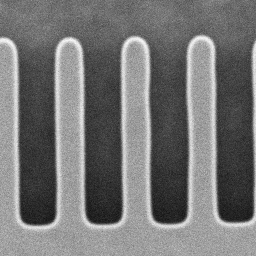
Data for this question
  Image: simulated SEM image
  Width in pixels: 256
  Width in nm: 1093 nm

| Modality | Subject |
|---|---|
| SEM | groups of lines, slits or small figures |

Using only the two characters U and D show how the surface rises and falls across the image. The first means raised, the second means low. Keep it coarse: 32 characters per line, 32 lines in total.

DDDDDDDDDDDDDDDDDDDDDDDDDDDDDDDD
DDDDDDDDDDDDDDDDDDDDDDDDDDDDDDDD
DDDDDDDDDDDDDDDDDDDDDDDDDDDDDDDD
DDDDDDDDDDDDDDDDDDDDDDDDDDDDDDDD
DDDDDDDDDDDDDDDDDDDDDDDDDDDDDDDD
UUDDDDDUUUDDDDDDUUDDDDDDUUUDDDDD
UUDDDDDUUUDDDDDUUUUDDDDDUUUDDDDD
UUDDDDDUUUDDDDDUUUUDDDDUUUUDDDDD
UUDDDDDUUUDDDDDUUUUDDDDUUUUDDDDD
UUDDDDDUUUDDDDDUUUUDDDDUUUUDDDDD
UUDDDDDUUUDDDDDUUUUDDDDUUUUDDDDD
UUDDDDDUUUDDDDDUUUUDDDDUUUUDDDDD
UUDDDDDUUUDDDDDUUUDDDDDUUUUDDDDD
UUDDDDDUUUDDDDDUUUUDDDDUUUUDDDDD
UUDDDDDUUUDDDDDUUUUDDDDDUUUDDDDD
UUDDDDDUUUDDDDDUUUUDDDDDUUUDDDDD
UUDDDDDUUUDDDDDUUUUDDDDDUUUDDDDD
UUDDDDDUUUDDDDDUUUUDDDDDUUUDDDDD
UUDDDDDUUUDDDDDUUUUDDDDDUUUDDDDD
UUDDDDDUUUDDDDDUUUUDDDDDUUUDDDDD
UUDDDDDUUUDDDDDUUUUDDDDDUUUDDDDD
UUDDDDDUUUDDDDDUUUUDDDDDUUUDDDDD
UUDDDDDUUUDDDDDUUUUDDDDDUUUDDDDD
UUDDDDDUUUDDDDDUUUUDDDDDUUUDDDDD
UUDDDDDUUUDDDDDUUUUDDDDDUUUDDDDD
UUDDDDDUUUUDDDDUUUUDDDDDUUUDDDDD
UUDDDDDUUUUDDDDUUUUDDDDDUUUDDDDD
UUUDDDDUUUUDDDDUUUUDDDDUUUUUDDDU
UUUUUUUUUUUUUUUUUUUUUUUUUUUUUUUU
UUUUUUUUUUUUUUUUUUUUUUUUUUUUUUUU
UUUUUUUUUUUUUUUUUUUUUUUUUUUUUUUU
UUUUUUUUUUUUUUUUUUUUUUUUUUUUUUUU